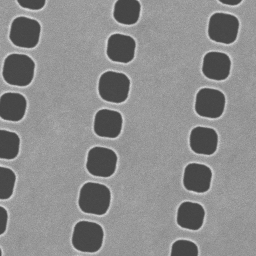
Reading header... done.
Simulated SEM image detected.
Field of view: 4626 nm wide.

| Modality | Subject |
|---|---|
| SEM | a regular array of holes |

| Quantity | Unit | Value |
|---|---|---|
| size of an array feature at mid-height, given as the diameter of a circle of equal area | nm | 566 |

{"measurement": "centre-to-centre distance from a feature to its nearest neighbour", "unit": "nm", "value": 683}